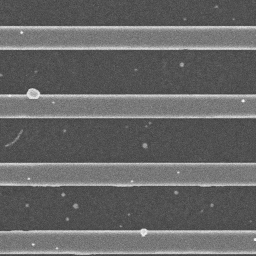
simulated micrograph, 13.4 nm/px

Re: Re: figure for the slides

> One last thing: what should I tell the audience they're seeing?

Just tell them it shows lines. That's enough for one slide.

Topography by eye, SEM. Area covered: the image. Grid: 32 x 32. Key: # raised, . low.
................................
................................
................................
################################
################################
################################
................................
................................
................................
................................
................................
...##...........................
################################
################################
################################
................................
................................
................................
................................
................................
################################
################################
################################
................................
................................
................................
................................
................................
................................
################################
################################
################################